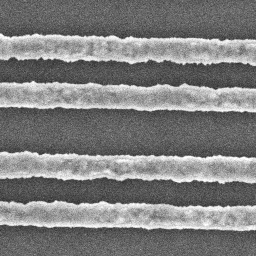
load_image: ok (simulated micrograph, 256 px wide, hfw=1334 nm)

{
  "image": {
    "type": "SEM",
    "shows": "lines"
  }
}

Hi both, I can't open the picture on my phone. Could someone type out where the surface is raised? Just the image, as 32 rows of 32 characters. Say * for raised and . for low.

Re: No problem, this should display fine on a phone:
................................
................................
................................
................................
*..*****........................
********************************
********************************
........**.*********************
................................
................................
*********..*....................
********************************
********************************
.....**..***********************
................................
................................
................................
................................
................................
***********.*..*.*..............
********************************
********************************
.....................***********
................................
................................
*********.*.***.**..............
********************************
********************************
..................*..**.********
................................
................................
................................